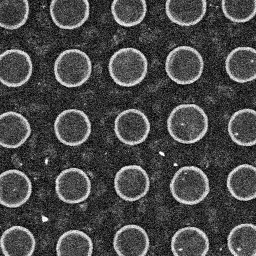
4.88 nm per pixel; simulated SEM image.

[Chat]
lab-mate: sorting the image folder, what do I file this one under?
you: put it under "a regular array of raised bodies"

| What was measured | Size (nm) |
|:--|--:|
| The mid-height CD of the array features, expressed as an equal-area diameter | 174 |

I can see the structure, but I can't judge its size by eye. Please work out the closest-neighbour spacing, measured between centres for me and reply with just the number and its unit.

274 nanometres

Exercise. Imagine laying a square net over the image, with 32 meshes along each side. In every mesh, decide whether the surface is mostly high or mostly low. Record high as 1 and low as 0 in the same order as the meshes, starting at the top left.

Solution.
11100001111000111100011111001111
11100011111000111100011111001111
11100001111000011100001110000110
00000000000000000000000000000000
00000000000000000000000000000000
00000000000000000000000000000000
01100000110000011000001100000111
11110001111000111100011110001111
11110001111000111100011110001111
11110001111000111100011110000111
01100000110000011000000000000000
00000000000000000000000000000000
00000000000000000000000000000000
00000000000000000000001110000000
11100001111000011100011111000111
11100001111000011110011111000111
11110001111000011100011111000111
11100000110000011100001110000111
00000000000000000000000000000000
00000000000000000000000000000000
00000000000000000000000000000000
01000000110000011100001110000111
11100001111000011100001111000111
11110001111000011100011111000111
11110000111000011100001110000111
01000000000000000000000000000000
00000000000000000000000000000000
00000000000000000000000000000000
00000000000000001000000000000011
11110000111000011100001111000111
11110001111000111100001111000111
01110001111000011100001111000111